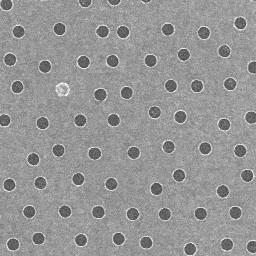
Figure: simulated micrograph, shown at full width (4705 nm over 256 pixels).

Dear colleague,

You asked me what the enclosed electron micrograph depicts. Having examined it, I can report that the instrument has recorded a regular array of holes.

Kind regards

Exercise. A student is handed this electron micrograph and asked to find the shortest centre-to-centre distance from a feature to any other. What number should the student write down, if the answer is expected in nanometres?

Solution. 521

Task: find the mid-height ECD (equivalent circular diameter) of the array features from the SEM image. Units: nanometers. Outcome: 227